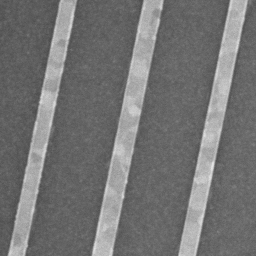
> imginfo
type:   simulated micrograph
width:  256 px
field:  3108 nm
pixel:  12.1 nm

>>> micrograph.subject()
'one or a few lines or trenches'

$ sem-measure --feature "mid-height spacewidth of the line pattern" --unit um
0.797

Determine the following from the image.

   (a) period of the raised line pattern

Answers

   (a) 1.01 micrometres